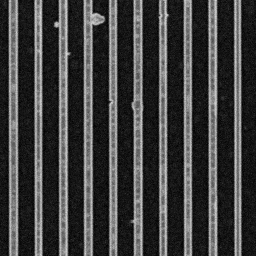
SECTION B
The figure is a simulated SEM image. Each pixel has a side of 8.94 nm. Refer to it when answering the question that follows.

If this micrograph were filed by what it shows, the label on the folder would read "parallel lines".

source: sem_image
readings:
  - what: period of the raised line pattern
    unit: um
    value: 0.223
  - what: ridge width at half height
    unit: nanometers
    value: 57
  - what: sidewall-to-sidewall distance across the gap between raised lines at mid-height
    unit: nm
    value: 163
